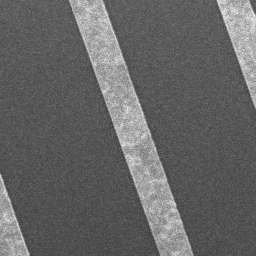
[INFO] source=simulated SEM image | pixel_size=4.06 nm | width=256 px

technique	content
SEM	one or a few lines or trenches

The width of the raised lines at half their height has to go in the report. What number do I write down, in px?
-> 30.8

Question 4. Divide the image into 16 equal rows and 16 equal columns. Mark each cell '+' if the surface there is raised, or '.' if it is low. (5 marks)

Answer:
.....++.......++
.....++.......++
.....++.......++
......++.......+
......++.......+
......++........
.......++.......
.......++.......
.......++.......
........++......
........++......
........++......
+........++.....
+........++.....
+.........++....
++........++....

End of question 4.